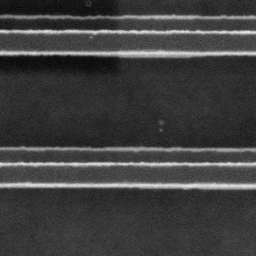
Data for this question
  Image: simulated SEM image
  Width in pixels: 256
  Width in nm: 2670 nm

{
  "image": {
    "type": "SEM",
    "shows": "lines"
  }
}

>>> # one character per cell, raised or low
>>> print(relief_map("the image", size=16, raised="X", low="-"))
----------------
XXXXXXXXXXXXXXXX
XXXXXXXXXXXXXXXX
----------------
----------------
----------------
----------------
----------------
----------------
XXXXXXXXXXXXXXXX
XXXXXXXXXXXXXXXX
XXXXXXXXXXXXXXXX
----------------
----------------
----------------
----------------